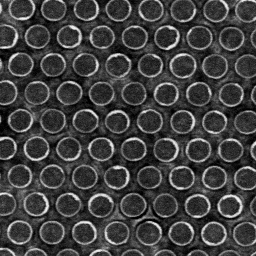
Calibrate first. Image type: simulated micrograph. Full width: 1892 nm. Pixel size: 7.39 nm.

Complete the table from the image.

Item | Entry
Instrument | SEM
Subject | a regular array of raised bodies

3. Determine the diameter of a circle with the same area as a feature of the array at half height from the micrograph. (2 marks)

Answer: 179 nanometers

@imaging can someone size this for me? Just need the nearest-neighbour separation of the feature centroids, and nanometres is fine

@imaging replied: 237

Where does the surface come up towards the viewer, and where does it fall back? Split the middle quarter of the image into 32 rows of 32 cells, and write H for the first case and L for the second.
LLHHHHHHHLHHHHHHHLLHHHHHHLLHHHHH
LLLHHHHHLLLHHHHHLLLHHHHHLLLHHHHH
LLLLHHHLLLLHHHHHLLLHHHHHLLLLHHHH
LLLLLLLLLLLLLLLLLLLLLLLLLLLLLLLL
HHLLLLLLLLLLLLLLLLLLLLLLLLLLLLLL
HHHHLLLHHHHHLLLHHHHHLLLLHHHHLLLH
HHHHLLLHHHHHLLLHHHHHLLLHHHHHLLLH
HHHHLLHHHHHHLLLHHHHHLLLHHHHHLLLH
HHHHLLLHHHHHLLLHHHHHLLLHHHHHLLLH
HHHLLLLHHHHLLLLLHHHHLLLLHHHHLLLH
LLLLLLLLLLLLLLLLLLLLLLLLLLLLLLLL
LLLLLLLLLLLLLLLLLLLLLHLLLLLLLLLL
LLLHHHHHLLLHHHHLLLLHHHHHLLLHHHHH
LLHHHHHHLLLHHHHHLLHHHHHHLLLHHHHH
LLHHHHHHLLHHHHHHLLHHHHHHLLLHHHHH
LLLHHHHHLLLHHHHHLLLHHHHHLLLHHHHH
LLLHHHHLLLLLHHHLLLLHHHHHLLLHHHHH
LLLLLLLLLLLLLLLLLLLLLLLLLLLLLLLL
LHLLLLLLLLLLLLLLLHLLLLLLLLLLLLLL
HHHHLLLHHHHHLLLHHHHHLLLHHHHHLLLH
HHHHLLHHHHHHLLHHHHHHLLHHHHHHHLLH
HHHHLLHHHHHHLLHHHHHHHLHHHHHHHLLH
HHHHLLLHHHHHLLHHHHHHLLLHHHHHLLLH
HHHLLLLLHHHLLLLHHHHHLLLHHHHHLLLH
LLLLLLLLLLLLLLLLLLLLLLLLLLLLLLLL
LLLLHHLLLLLLLHLLLLLLLLLLLLLLLLLL
LLLHHHHHLLLHHHHHLLLHHHHLLLLHHHHH
LLHHHHHHLLHHHHHHLLLHHHHHLLLHHHHH
LLHHHHHHLLHHHHHHLLLHHHHHLLLHHHHH
LLHHHHHHLLHHHHHHLLLHHHHHLLLHHHHH
LLLHHHHLLLLHHHHLLLLHHHHLLLLHHHHH
LLLLLLLLLLLLLLLLLLLLLLLLLLLLLLLL